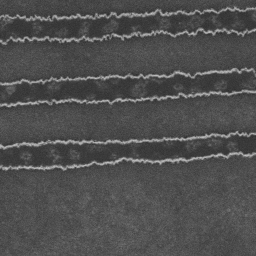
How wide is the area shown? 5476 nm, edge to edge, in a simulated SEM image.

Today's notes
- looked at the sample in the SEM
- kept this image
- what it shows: one or a few lines or trenches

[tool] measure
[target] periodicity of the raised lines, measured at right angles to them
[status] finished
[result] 1340 nanometres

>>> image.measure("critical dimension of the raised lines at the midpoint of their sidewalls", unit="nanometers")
470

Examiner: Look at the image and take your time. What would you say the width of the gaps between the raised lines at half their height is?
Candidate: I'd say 40.8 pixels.